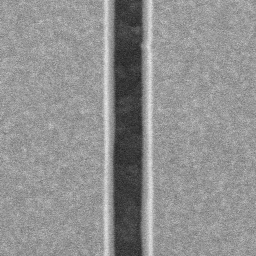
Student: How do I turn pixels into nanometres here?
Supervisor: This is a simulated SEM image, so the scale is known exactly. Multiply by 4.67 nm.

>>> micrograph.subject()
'one or a few lines or trenches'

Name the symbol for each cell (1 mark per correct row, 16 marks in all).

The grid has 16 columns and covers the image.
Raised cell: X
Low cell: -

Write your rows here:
XXXXXXX--XXXXXXX
XXXXXXX--XXXXXXX
XXXXXXX--XXXXXXX
XXXXXXX--XXXXXXX
XXXXXXX--XXXXXXX
XXXXXXX--XXXXXXX
XXXXXXX--XXXXXXX
XXXXXXX--XXXXXXX
XXXXXXX--XXXXXXX
XXXXXXX--XXXXXXX
XXXXXXX--XXXXXXX
XXXXXXX--XXXXXXX
XXXXXXX--XXXXXXX
XXXXXXX--XXXXXXX
XXXXXXX--XXXXXXX
XXXXXXX--XXXXXXX